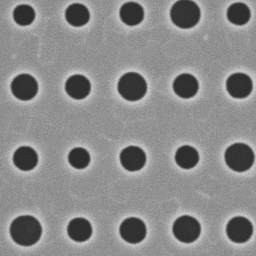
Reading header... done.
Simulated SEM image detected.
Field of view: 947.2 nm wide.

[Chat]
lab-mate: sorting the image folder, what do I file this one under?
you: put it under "a regular array of holes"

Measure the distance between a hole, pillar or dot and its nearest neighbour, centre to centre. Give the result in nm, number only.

198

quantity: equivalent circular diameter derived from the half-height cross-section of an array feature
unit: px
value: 26.1